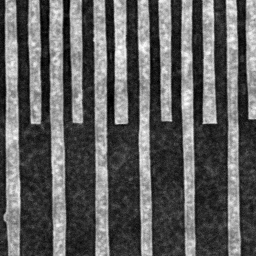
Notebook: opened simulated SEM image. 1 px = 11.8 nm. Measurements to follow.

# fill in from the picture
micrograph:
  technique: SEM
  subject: parallel lines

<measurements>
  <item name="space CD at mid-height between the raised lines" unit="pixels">10.9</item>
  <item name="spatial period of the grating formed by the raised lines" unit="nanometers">261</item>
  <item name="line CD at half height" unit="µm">0.13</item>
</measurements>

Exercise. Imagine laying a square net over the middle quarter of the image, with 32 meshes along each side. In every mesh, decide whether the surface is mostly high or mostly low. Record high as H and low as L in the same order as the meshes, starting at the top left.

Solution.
LLHHLLLLHHHLLHHLLLLHHLLLHHHLLLHH
LLHHLLLLHHHLLHHLLLLHHLLLHHHLLLHH
LLHHLLLLHHHLLHHLLLLHHLLLHHHLLLHH
LLHHLLLLHHHLLHHHLLLHHLLLHHHLLHHH
LLHHLLLLHHHLLHHHLLLHHLLLHHLLLHHH
LLHHLLLLHHHLLHHHLLLHHLLLHHLLLHHH
LLHHLLLLHHHLLHHHLLLHHLLLHHLLLHHH
LLHHLLLLHHHLLHHHLLLHHLLLHHLLLHHH
LLHHLLLLHHHLLHHHLLLHHLLLHHLLLHHH
LLHHLLLLHHHLLHHHLLLHHLLLHHHLLHHH
LLHHLLLLHHHLLHHHLLLHHLLLHHHLLHHH
LLHHLLLLHHLLLHHHLLLHHLLLHHHLLLHH
LLHHLLLLHHHLLHHHLLLHHLLLLHHLLLHH
LLHHLLLLHHLLLHHHLLLHHLLLLHHLLLHH
LLLHLLLLHHLLLHHHLLLHHLLLLLLLLLHH
LLLLLLLLHHLLLLLLLLLHHLLLLLLLLLHH
LLLLLLLLHHLLLLLLLLLHHLLLLLLLLLHH
LLLLLLLLHHHLLLLLLLLHHLLLLLLLLLHH
LLLLLLLLHHLLLLLLLLLHHLLLLLLLLLHH
LLLLLLLLHHHLLLLLLLLHHLLLLLLLLLHH
LLLLLLLLHHHLLLLLLLLHHLLLLLLLLLHH
LLLLLLLLHHHLLLLLLLLHHLLLLLLLLLHH
LLLLLLLLHHHLLLLLLLLHHLLLLLLLLLHH
LLLLLLLLHHHLLLLLLLLHHLLLLLLLLLHH
LLLLLLLLHHHLLLLLLLLHHHLLLLLLLLHH
LLLLLLLLHHHLLLLLLLLHHHLLLLLLLLHH
LLLLLLLLHHHLLLLLLLLHHHLLLLLLLLHH
LLLLLLLLHHHLLLLLLLLHHHLLLLLLLLHH
LLLLLLLLHHHLLLLLLLLHHHLLLLLLLLHH
LLLLLLLLHHHLLLLLLLLHHHLLLLLLLLHH
LLLLLLLLHHHLLLLLLLLHHHLLLLLLLLHH
LLLLLLLLHHHLLLLLLLLHHHLLLLLLLLHH